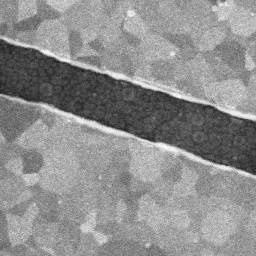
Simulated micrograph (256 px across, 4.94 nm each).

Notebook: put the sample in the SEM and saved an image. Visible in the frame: one or a few lines or trenches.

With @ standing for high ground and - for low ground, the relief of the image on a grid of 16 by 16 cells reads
@@@@@@@@@@@@@@@@
@@@@@@@@@@@@@@@@
-@@@@@@@@@@@@@@@
---@@@@@@@@@@@@@
-------@@@@@@@@@
----------@@@@@@
@@-----------@@@
@@@@@-----------
@@@@@@@@--------
@@@@@@@@@@@-----
@@@@@@@@@@@@@@--
@@@@@@@@@@@@@@@@
@@@@@@@@@@@@@@@@
@@@@@@@@@@@@@@@@
@@@@@@@@@@@@@@@@
@@@@@@@@@@@@@@@@